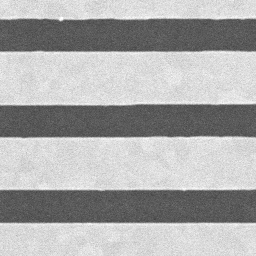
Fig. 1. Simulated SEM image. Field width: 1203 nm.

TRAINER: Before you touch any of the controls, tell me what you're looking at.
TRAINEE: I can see lines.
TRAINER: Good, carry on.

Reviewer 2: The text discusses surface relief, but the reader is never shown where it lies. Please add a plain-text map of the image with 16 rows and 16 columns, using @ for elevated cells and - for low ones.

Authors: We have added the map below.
@@@@@@@@@@@@@@@@
----------------
----------------
@@@@@@@@@@@@@@@@
@@@@@@@@@@@@@@@@
@@@@@@@@@@@@@@@@
@@@@@@@@@-------
----------------
----------------
@@@@@@@@@@@@@@@@
@@@@@@@@@@@@@@@@
@@@@@@@@@@@@@@@@
----------------
----------------
@@@@@@@@@@@@@@@@
@@@@@@@@@@@@@@@@